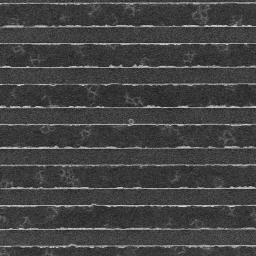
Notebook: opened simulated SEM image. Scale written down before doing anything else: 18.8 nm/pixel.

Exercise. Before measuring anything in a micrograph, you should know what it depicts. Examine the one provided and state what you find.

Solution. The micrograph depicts parallel lines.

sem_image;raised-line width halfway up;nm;448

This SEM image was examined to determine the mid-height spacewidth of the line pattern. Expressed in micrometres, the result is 0.305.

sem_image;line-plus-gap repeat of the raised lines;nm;758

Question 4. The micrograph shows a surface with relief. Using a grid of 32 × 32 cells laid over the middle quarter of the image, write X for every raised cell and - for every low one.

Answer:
XXXXXXXXXXXXXXXXXXXXXXXXXXXXXXXX
--------------------------------
--------------------------------
--------------------------------
--------------------------------
XXXXXXXXXXXXXXXXXXXXXXXXXXXXXXXX
XXXXXXXXXXXXXXXXXXXXXXXXXXXXXXXX
XXXXXXXXXXXXXXXXXXXXXXXXXXXXXXXX
XXXXXXXXXXXXXXXXXXXXXXXXXXXXXXXX
XXXXXXXXXXXXXXXXXXXXXXXXXXXXXXXX
XXXXXXXXXXXXXXXXXXXXXXXXXXXXXXXX
--------------------------------
--------------------------------
--------------------------------
----------------X---------------
XXXXXXXXXXXXXXXXXXXXXXXXXXXXXXXX
XXXXXXXXXXXXXXXXXXXXXXXXXXXXXXXX
XXXXXXXXXXXXXXXXXXXXXXXXXXXXXXXX
XXXXXXXXXXXXXXXXXXXXXXXXXXXXXXXX
XXXXXXXXXXXXXXXXXXXXXXXXXXXXXXXX
XXXXXXXXXXXXXXXXXXXXXXXXXXXXXXXX
--------------------------------
--------------------------------
--------------------------------
--------------------------------
XXXXXXXXXXXXXXXXXXXXXXXXXXXXXXXX
XXXXXXXXXXXXXXXXXXXXXXXXXXXXXXXX
XXXXXXXXXXXXXXXXXXXXXXXXXXXXXXXX
XXXXXXXXXXXXXXXXXXXXXXXXXXXXXXXX
XXXXXXXXXXXXXXXXXXXXXXXXXXXXXXXX
XXXXXXXXXXXXXXXXXXXXXXXXXXXXXXXX
--------------------------------